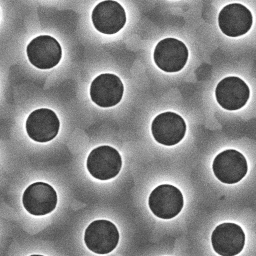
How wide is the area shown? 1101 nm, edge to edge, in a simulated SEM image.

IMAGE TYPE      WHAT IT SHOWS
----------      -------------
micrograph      a regular array of holes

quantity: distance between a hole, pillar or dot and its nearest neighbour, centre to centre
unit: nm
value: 312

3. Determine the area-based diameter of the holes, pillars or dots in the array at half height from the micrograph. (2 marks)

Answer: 152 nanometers